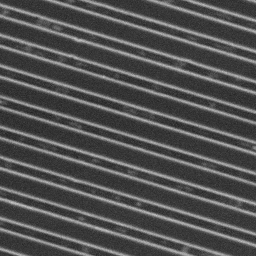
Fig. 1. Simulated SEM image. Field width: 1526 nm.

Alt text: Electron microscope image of parallel lines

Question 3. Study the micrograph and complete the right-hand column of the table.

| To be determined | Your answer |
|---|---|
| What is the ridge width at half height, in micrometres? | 0.12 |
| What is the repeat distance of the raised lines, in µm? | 0.174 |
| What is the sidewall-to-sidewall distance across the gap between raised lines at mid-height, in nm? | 55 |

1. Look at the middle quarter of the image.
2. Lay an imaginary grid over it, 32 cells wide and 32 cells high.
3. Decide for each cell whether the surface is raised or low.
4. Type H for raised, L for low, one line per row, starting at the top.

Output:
HLLLLLLLLHHHHHHHHHHHHHHHHHLLLLLL
HHHHLLLLLLLLHHHHHHHHHHHHHHHHHLLL
HHHHHHHHLLLLLLLLHHHHHHHHHHHHHHHH
HHHHHHHHHHHLLLLLLLLHHHHHHHHHHHHH
HHHHHHHHHHHHHHLLLLLLLLHHHHHHHHHH
HHHHHHHHHHHHHHHHHHLLLLLLLLHHHHHH
LLLLHHHHHHHHHHHHHHHHHLLLLLLLLHHH
LLLLLLLHHHHHHHHHHHHHHHHHLLLLLLLL
HHLLLLLLLLHHHHHHHHHHHHHHHHHHLLLL
HHHHHLLLLLLLLHHHHHHHHHHHHHHHHHHL
HHHHHHHHHLLLLLLLLHHHHHHHHHHHHHHH
HHHHHHHHHHHHLLLLLLLLHHHHHHHHHHHH
HHHHHHHHHHHHHHHLLLLLLLLHHHHHHHHH
LHHHHHHHHHHHHHHHHHHLLLLLLLLHHHHH
LLLLLHHHHHHHHHHHHHHHHHLLLLLLLLHH
LLLLLLLLHHHHHHHHHHHHHHHHHLLLLLLL
HHHLLLLLLLLHHHHHHHHHHHHHHHHHHLLL
HHHHHHHLLLLLLLLHHHHHHHHHHHHHHHHH
HHHHHHHHHHLLLLLLLLHHHHHHHHHHHHHH
HHHHHHHHHHHHHLLLLLLLLHHHHHHHHHHH
HHHHHHHHHHHHHHHHLLLLLLLLLHHHHHHH
LLHHHHHHHHHHHHHHHHHHLLLLLLLLHHHH
LLLLLLHHHHHHHHHHHHHHHHHLLLLLLLLH
HLLLLLLLLLHHHHHHHHHHHHHHHHLLLLLL
HHHHLLLLLLLLHHHHHHHHHHHHHHHHHHLL
HHHHHHHHLLLLLLLLHHHHHHHHHHHHHHHH
HHHHHHHHHHHLLLLLLLLHHHHHHHHHHHHH
HHHHHHHHHHHHHHLLLLLLLLHHHHHHHHHH
LHHHHHHHHHHHHHHHHHLLLLLLLLHHHHHH
LLLLHHHHHHHHHHHHHHHHHLLLLLLLLHHH
LLLLLLLLHHHHHHHHHHHHHHHHLLLLLLLL
HHLLLLLLLLLHHHHHHHHHHHHHHHHHLLLL